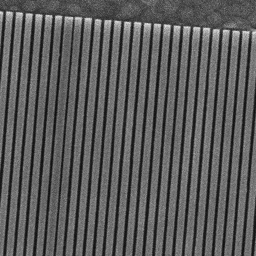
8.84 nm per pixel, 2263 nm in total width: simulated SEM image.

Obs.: parallel lines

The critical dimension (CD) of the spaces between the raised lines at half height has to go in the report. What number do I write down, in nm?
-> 29.7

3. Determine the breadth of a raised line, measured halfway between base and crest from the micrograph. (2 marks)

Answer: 0.0606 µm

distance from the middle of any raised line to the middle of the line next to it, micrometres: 0.0873